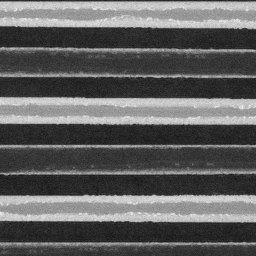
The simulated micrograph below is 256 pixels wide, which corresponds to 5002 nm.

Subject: lines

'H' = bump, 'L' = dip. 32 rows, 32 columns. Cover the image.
LLLLLLLLLLLLLLLLLLLLLLLLLLLLLLLL
HHHHHHHHHHHHHHHHHHHHHHHHHHHHHHHH
HHHHHHHHHHHHHHHHHHHHHHHHHHHHHHHH
LLLLLLLLLLLLLLLLLLLLLLLLLLLLLLLL
LLLLLLLLLLLLLLLLLLLLLLLLLLLLLLLL
LLLLLLLLLLLLLLLLLLLLLLLLLLLLLLLL
HHHHHHHHHHHHHHHHHHHHHHHHHHHHHHHH
HHHHHHHHHHHHHHHHHHHHHHHHHHHHHHHH
HHHHHHHHHHHHHHHHHHHHHHHHHHHHHHHH
HHHHHHHHHHHHHHHHHHHHHHHHHHHHHHHH
LLLLLLLLLLLLLLLLLLLLLLLLLLLLLLLL
LLLLLLLLLLLLLLLLLLLLLLLLLLLLLLLL
HHHHHHHHHHHHHHLLLLLLLLLLLLLLLLLL
HHHHHHHHHHHHHHHHHHHHHHHHHHHHHHHH
HHHHHHHHHHHHHHHHHHHHHHHHHHHHHHHH
LLLLLLLLLLLLLLLLLLLLLLLLLLLLLLLL
LLLLLLLLLLLLLLLLLLLLLLLLLLLLLLLL
LLLLLLLLLLLLLLLLLLLLLLLLLLLLLLLL
HHHHHHHHHHHHHHHHHHHHHHHHHHHHHHHH
HHHHHHHHHHHHHHHHHHHHHHHHHHHHHHHH
HHHHHHHHHHHHHHHHHHHHHHHHHHHHHHHH
HHHHHHHHHHHHHHHHHHHHHHHHHHHHHHHH
LLLLLLLLLLLLLLLLLLLLLLLLLLLLLLLL
LLLLLLLLLLLLLLLLLLLLLLLLLLLLLLLL
LLLLLLLLLLLLLLLLLLLLLLLLLLLLLLLL
HHHHHHHHHHHHHHHHHHHHHHHHHHHHHHHH
HHHHHHHHHHHHHHHHHHHHHHHHHHHHHHHH
LLLLLLLLLLLLLLLLLLLLLLLLLLLLLLLL
LLLLLLLLLLLLLLLLLLLLLLLLLLLLLLLL
LLLLLLLLLLLLLLLLLLLLLLLLLLLLLLLL
HHHHHHHHHHHHHHHHHHHHHHHHHHHHHHHH
HHHHHHHHHHHHHHHHHHHHHHHHHHHHHHHH